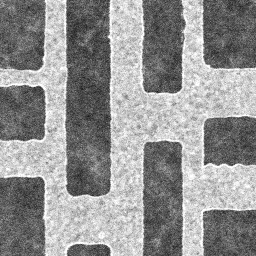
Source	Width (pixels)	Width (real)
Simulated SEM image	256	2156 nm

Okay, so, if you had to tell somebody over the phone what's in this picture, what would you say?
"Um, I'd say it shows one or a few lines or trenches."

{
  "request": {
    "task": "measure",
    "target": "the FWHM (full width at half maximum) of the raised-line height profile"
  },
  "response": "178 nm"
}